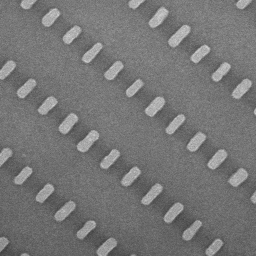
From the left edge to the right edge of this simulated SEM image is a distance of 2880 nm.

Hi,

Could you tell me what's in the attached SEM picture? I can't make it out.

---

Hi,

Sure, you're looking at a regular array of raised bodies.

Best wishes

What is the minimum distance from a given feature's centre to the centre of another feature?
306 nm